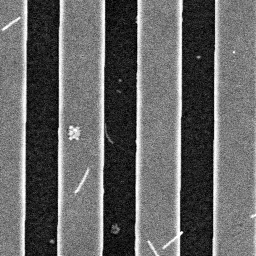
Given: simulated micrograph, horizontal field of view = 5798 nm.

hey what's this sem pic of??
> lines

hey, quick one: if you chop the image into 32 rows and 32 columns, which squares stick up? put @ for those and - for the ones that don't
@@@-----@@@@@----@@@@@@----@@@@@
@@@-----@@@@@----@@@@@@----@@@@@
@@@-----@@@@@----@@@@@@----@@@@@
@@@----@@@@@@----@@@@@@----@@@@@
@@@----@@@@@@----@@@@@@----@@@@@
@@@----@@@@@@----@@@@@@----@@@@@
@@@----@@@@@@----@@@@@@----@@@@@
@@@----@@@@@@----@@@@@@----@@@@@
@@@----@@@@@@----@@@@@@----@@@@@
@@@----@@@@@@----@@@@@@----@@@@@
@@@----@@@@@@----@@@@@@----@@@@@
@@@----@@@@@@----@@@@@@----@@@@@
@@@----@@@@@@----@@@@@@----@@@@@
@@@----@@@@@@----@@@@@@----@@@@@
@@@----@@@@@@----@@@@@@----@@@@@
@@@----@@@@@@----@@@@@@----@@@@@
@@@----@@@@@@----@@@@@@----@@@@@
@@@----@@@@@@----@@@@@@----@@@@@
@@@----@@@@@@----@@@@@@----@@@@@
@@@----@@@@@@----@@@@@@----@@@@@
@@@----@@@@@@----@@@@@@----@@@@@
@@@----@@@@@@----@@@@@@----@@@@@
@@@----@@@@@@----@@@@@@----@@@@@
@@@----@@@@@@----@@@@@@----@@@@@
@@@----@@@@@@----@@@@@-----@@@@@
@@@----@@@@@@----@@@@@-----@@@@@
@@@----@@@@@@----@@@@@-----@@@@@
@@@----@@@@@@----@@@@@-----@@@@@
@@@----@@@@@@----@@@@@-----@@@@@
@@@----@@@@@@----@@@@@@----@@@@@
@@@----@@@@@@----@@@@@-----@@@@@
@@@----@@@@@@----@@@@@-----@@@@@